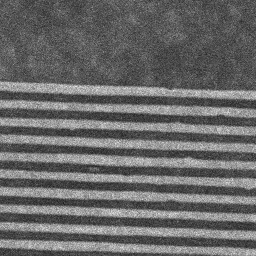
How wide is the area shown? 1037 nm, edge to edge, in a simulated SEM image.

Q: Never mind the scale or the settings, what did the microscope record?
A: parallel lines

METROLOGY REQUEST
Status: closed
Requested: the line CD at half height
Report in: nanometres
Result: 32.4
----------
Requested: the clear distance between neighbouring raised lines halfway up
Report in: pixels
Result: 9.01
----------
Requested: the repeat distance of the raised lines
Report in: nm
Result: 70.5